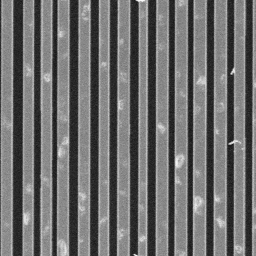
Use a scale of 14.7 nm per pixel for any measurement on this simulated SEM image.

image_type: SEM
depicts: parallel lines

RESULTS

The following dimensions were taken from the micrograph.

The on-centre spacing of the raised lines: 0.286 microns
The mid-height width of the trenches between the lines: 114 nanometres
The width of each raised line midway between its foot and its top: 169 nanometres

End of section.